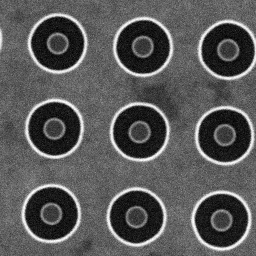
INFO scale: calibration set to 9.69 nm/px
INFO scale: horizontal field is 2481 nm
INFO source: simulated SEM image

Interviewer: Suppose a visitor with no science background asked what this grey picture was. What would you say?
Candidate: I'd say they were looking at an array of small figures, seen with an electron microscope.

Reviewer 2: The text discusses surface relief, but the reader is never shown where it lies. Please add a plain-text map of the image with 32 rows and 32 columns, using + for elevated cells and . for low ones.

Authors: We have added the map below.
++++++++++++++++++++++++++++++++
++++++++++++++++++++++++++++++++
+++++....++++++++..+++++++++++++
++++......+++++.....+++++++....+
++++...+...++++......+++++.....+
++++..++...+++...++..++++...+...
++++...+..++++...++..++++..+++..
++++......+++++......++++.......
++++++...+++++++....++++++.....+
+++++++++++++++++++++++++++...++
++++++++++++++++++++++++++++++++
++++++++++++++++++++++++++++++++
++++++++++++++++++++++++++++++++
+++++....+++++++...+++++++++++++
++++......+++++.....++++++.....+
+++...++..++++...+...++++......+
+++...++..++++..+++..++++..++...
++++......++++...+...++++..++..+
++++.....++++++.....+++++......+
++++++..++++++++...+++++++....++
++++++++++++++++++++++++++++++++
++++++++++++++++++++++++++++++++
++++++++++++++++++++++++++++++++
+++++...++++++++++++++++++++++++
++++.....++++++....+++++++...+++
+++.......++++......+++++......+
+++..+++..++++..++..++++...+...+
+++...+...++++..++...+++...++..+
+++......+++++......++++...+...+
++++....+++++++.....+++++......+
++++++++++++++++..++++++++...+++
++++++++++++++++++++++++++++++++